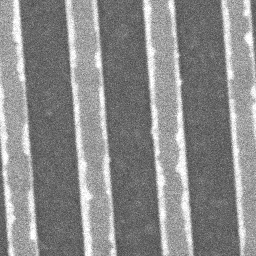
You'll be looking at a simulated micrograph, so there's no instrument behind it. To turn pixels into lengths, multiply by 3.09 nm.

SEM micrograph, one or a few lines or trenches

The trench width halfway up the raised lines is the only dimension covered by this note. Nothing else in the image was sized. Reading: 148 nanometers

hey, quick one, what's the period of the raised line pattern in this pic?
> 237 nm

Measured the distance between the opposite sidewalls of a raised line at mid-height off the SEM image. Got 89.2 nanometers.